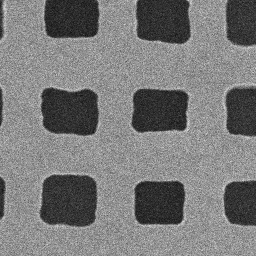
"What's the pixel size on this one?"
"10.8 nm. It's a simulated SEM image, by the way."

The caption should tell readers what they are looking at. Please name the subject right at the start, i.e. holes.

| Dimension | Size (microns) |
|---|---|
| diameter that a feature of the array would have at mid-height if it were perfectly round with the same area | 0.592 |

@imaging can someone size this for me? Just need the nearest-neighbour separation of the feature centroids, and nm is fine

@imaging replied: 963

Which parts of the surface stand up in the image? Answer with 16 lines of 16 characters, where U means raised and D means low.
UUUDDDUUUDDDUUDD
UUUDDDUUUDDDUUDD
UUUUUUUUUDDDUUDD
UUUUUUUUUUUUUUUU
UUUUUUUUUUUUUUUU
UUUUUUUUUUUUUUUD
UUUDDDUUDDDDUUDD
UUUDDDUUDDDDUUDD
UUUUUUUUUUUUUUUD
UUUUUUUUUUUUUUUU
UUUUUUUUUUUUUUUU
UUUDDDUUUDDUUUDD
UUUDDDUUDDDDUUDD
UUUDDDUUDDDUUUDD
UUUUUUUUUUUUUUUU
UUUUUUUUUUUUUUUU